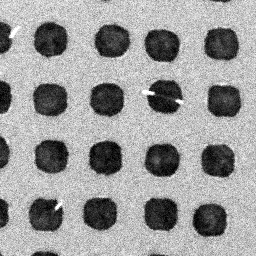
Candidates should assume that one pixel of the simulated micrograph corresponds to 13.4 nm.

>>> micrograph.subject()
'a regular array of holes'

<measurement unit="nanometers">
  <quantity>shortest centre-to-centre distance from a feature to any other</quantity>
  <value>728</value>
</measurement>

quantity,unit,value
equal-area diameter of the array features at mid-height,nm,479